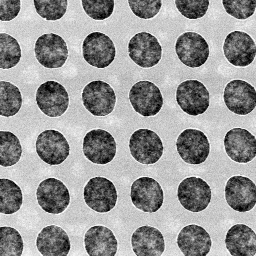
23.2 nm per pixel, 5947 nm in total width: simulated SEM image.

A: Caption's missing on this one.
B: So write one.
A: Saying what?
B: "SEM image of a regular array of holes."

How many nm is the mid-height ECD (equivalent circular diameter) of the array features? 814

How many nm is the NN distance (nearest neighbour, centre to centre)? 1090